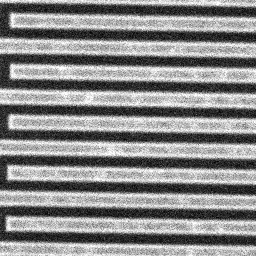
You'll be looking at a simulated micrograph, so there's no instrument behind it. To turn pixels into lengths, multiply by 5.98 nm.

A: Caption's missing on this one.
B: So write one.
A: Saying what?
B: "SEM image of parallel lines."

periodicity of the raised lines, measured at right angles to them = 0.152 µm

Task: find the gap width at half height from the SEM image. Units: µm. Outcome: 0.0815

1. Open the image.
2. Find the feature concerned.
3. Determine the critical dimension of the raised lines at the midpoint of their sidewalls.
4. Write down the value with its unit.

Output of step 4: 70.3 nm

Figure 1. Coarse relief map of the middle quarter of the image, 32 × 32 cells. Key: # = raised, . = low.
................................
################################
################################
################################
................................
................................
................................
##########################......
################################
################################
.............................###
................................
................................
######..........................
################################
################################
.......................#########
................................
................................
................................
################################
################################
...#############################
................................
................................
................................
#######################.........
################################
################################
................................
................................
................................